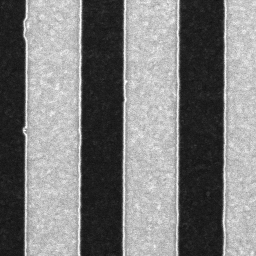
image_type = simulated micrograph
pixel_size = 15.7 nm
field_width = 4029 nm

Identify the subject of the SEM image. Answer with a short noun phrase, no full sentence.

one or a few lines or trenches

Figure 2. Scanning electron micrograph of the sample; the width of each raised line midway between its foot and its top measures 734 nm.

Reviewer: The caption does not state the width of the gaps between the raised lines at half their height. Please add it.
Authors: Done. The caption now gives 0.835 microns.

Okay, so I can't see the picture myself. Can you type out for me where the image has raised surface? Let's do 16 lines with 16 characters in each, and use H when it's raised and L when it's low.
HHLLLHHHLLLHHHLL
HHLLLHHHLLLHHHLL
HHLLLHHHLLLHHHLL
HHLLLHHHLLLHHHLL
HHLLLHHHLLLHHHLL
HHLLLHHHLLLHHHLL
HHLLLHHHLLLHHHLL
HHLLLHHHLLLHHHLL
HHLLLHHHLLLHHHLL
HHLLLHHHLLLHHHLL
HHLLLHHHLLLHHHLL
HHLLLHHHLLLHHHLL
HHLLLHHHLLLHHHLL
HHLLLHHHLLLHHHLL
HHLLLHHHLLLHHHLL
HHLLLHHHLLLHHHLL